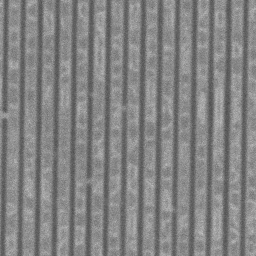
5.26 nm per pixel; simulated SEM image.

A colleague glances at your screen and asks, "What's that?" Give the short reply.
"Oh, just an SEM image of parallel lines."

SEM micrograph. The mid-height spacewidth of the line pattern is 33.5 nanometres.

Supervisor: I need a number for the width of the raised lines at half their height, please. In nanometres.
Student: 57.2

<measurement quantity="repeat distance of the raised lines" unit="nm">90.1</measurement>